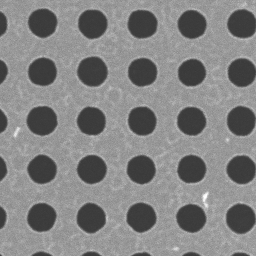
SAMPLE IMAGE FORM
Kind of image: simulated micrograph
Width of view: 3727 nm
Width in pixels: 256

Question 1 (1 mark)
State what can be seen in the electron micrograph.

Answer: a regular array of holes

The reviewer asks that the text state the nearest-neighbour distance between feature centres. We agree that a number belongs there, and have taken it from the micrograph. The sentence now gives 700 nm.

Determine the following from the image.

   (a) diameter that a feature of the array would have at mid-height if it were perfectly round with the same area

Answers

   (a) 432 nanometers